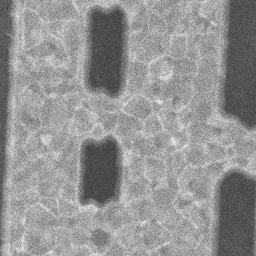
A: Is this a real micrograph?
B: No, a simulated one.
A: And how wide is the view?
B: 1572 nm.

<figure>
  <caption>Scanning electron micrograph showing one or a few lines or trenches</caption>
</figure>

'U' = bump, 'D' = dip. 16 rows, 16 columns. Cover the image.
DUUUUUDDUUUUUUDD
DUUUUDDDUUUUUUDD
DUUUUDDDUUUUUUDD
DUUUUDDDUUUUUUDD
DUUUUDDDUUUUUUDD
DUUUUDDDUUUUUUDD
DUUUUUUUUUUUUUDD
DUUUUUUUUUUUUUDD
DUUUUUUUUUUUUUUU
DUUUUDDDUUUUUUUU
DUUUUDDDUUUUUUUU
DUUUUDDDUUUUUDDD
DUUUUDDUUUUUUDDD
UUUUUUUUUUUUUDDD
UUUUUUUUUUUUUDDD
UUUUUUUUUUUUUDDD